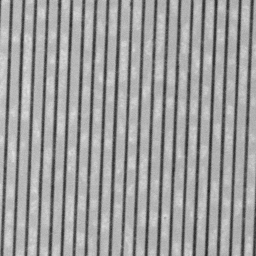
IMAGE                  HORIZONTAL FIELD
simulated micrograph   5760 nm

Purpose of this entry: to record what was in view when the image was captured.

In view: parallel lines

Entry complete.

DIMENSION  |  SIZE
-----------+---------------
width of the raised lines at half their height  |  197 nanometers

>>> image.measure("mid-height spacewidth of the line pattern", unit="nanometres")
81.5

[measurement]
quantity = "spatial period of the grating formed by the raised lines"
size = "270 nm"